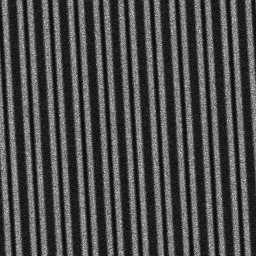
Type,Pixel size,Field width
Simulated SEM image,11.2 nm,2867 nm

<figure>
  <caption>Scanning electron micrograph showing parallel lines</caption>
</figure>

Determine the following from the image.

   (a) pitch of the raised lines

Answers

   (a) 12.7 pixels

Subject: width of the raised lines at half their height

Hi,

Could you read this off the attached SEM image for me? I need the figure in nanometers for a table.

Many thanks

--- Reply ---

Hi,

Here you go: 64.3